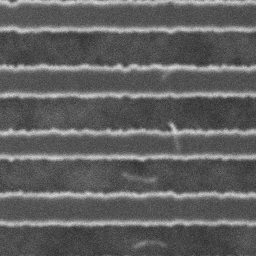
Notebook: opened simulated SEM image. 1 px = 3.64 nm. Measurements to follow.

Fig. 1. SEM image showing lines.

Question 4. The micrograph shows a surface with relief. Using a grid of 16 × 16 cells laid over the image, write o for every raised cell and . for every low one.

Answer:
oooooooooooooooo
oooooooooooooooo
................
................
oooooooooooooooo
oooooooooooooooo
................
................
oooooooooooooooo
oooooooooooooooo
................
................
oooooooooooooooo
oooooooooooooooo
................
................